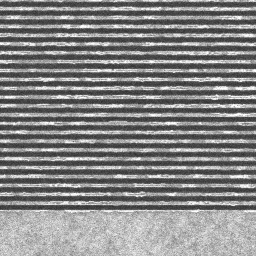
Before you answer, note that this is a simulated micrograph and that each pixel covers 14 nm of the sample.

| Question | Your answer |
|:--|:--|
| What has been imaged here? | parallel lines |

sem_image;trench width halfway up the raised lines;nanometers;73.7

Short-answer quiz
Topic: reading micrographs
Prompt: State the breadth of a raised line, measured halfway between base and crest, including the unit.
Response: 3.63 pixels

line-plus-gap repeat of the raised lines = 124 nm